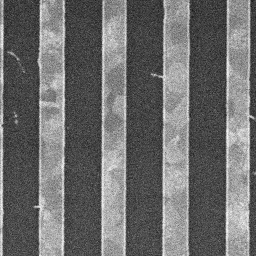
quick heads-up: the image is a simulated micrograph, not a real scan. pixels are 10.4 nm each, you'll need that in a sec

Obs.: one or a few lines or trenches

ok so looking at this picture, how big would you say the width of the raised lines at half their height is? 232 nanometres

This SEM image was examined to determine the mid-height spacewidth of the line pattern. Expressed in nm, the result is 410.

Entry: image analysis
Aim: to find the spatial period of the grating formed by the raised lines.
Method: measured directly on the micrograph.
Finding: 62.1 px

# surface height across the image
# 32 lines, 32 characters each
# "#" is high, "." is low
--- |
.....###.....###.....##......##.
.....###.....###.....###.....##.
.....###.....###.....##......##.
.....###.....###.....##......##.
.....###.....###.....##......##.
.....###.....###.....###.....##.
.....###.....###.....###.....##.
.....###.....###.....##......##.
.....###.....###.....##......##.
.....###.....###....###......##.
.....###.....###.....##......##.
.....###.....###.....##.....###.
.....###.....###.....##.....###.
.....###.....###.....##.....###.
.....###.....###.....##.....###.
.....###.....###.....##.....###.
.....###.....###.....##.....###.
.....###.....###.....##.....###.
.....###.....###.....##.....###.
.....###.....###.....##.....###.
.....###.....###.....##.....###.
.....###.....###.....##.....###.
.....###.....###.....##.....###.
.....###.....###.....##.....###.
.....###.....###....###.....###.
.....###.....###....###.....###.
.....###.....###....###.....###.
.....###.....###.....##.....###.
.....###.....###....###.....###.
.....###.....###....###.....###.
.....###.....###....###.....###.
.....###.....###....###.....###.